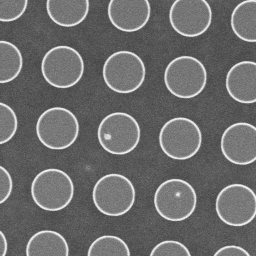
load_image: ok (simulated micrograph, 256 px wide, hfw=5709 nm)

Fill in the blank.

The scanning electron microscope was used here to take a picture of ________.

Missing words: an array of small figures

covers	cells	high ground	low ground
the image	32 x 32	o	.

ooo...ooooo...ooooo...oooo....oo
ooo...ooooo...ooooo..ooooo...ooo
oo.....ooo....oooo...ooooo...ooo
...............oo.....oooo...ooo
.......................o......oo
o...............................
oo....oooo.....o................
ooo..ooooo...ooooo....ooo.......
ooo..ooooo...ooooo...oooo....ooo
oo....oooo...ooooo...ooooo..oooo
......ooo....ooooo...ooooo..oooo
...............o.....oooo....ooo
..............................oo
o......o........................
oo...oooo....ooo................
oo...ooooo...oooo....ooo.....oo.
oo...ooooo..ooooo...ooooo...oooo
o....oooo...ooooo...ooooo...oooo
......oo.....oooo...ooooo...oooo
.....................ooo....oooo
..............................o.
o....ooo........................
o...ooooo...oooo.....oo.........
o...ooooo...ooooo...oooo....ooo.
o...ooooo...ooooo..ooooo...ooooo
.....ooo....ooooo..ooooo...ooooo
.............ooo....oooo...ooooo
.....................oo.....ooo.
................................
....oooo........................
o..ooooo....oooo....ooo.........
o..ooooo...ooooo...ooooo...oooo.